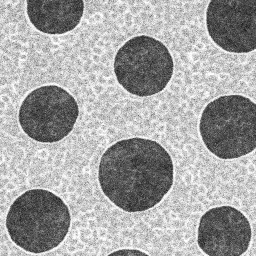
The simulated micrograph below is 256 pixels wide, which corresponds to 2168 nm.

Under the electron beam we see holes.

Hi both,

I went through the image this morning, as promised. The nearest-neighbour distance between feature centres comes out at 0.902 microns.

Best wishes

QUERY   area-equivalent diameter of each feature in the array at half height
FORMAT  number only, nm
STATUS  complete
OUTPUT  532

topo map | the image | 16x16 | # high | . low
##...########...
##...########...
########..###...
#######....#####
#######....#####
##..####..######
#....########...
#....#######....
##..#########...
#######...###...
######.....#####
######.....#####
#...###...######
....#########..#
....########....
#..##########...